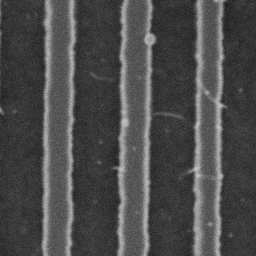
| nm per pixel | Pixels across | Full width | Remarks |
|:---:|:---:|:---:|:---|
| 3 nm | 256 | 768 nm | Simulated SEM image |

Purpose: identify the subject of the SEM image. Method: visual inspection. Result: lines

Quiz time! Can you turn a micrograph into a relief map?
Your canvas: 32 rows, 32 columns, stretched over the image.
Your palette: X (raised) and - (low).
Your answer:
------XXX------XXXX------XXX----
------XXX------XXXX------XXX----
------XXX------XXXX------XXX----
------XXX------XXXX------XXX----
------XXX------XXXX------XXX----
------XXX------XXXX------XXX----
------XXX------XXXX------XXX----
------XXX------XXXX------XXX----
------XXX------XXXX------XXX----
------XXX------XXXX------XXX----
------XXX------XXXX------XXX----
------XXX------XXXX------XXX----
------XXX------XXXX-----XXXX----
------XXX------XXXX------XXX----
------XXX------XXXX------XXX----
------XXX------XXXX-----XXXX----
------XXX------XXXX-----XXXX----
------XXX------XXXX-----XXXX----
------XXX------XXXX-----XXXX----
------XXX------XXXX-----XXXX----
------XXX------XXXX-----XXXX----
------XXX------XXXX-----XXXX----
------XXX------XXXX-----XXXX----
------XXX------XXXX-----XXXX----
-----XXXX------XXXX-----XXX-----
-----XXXX------XXXX-----XXX-----
------XXX------XXX------XXX-----
-----XXXX------XXX------XXXX----
-----XXXX------XXX------XXXX----
-----XXXX------XXX------XXX-----
-----XXXX------XXX------XXX-----
-----XXXX------XXX------XXX-----